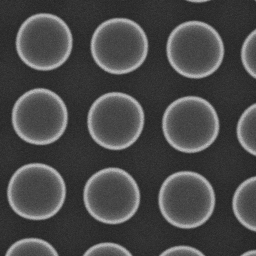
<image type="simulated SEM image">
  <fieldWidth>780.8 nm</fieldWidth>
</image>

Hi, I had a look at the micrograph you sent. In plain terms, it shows an array of small figures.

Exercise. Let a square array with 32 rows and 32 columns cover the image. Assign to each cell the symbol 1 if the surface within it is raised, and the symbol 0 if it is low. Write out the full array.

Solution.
00000000000000000000000000000000
00000000000000000000000000000000
00011111000001110000000000000000
00011111100011111100001111100000
00111111100011111100011111100001
00111111100111111100011111110011
00111111100111111100011111110011
00011111000011111100011111110011
00001110000001111000001111100001
00000000000000000000000111000001
00000000000000000000000000000000
00011110000000000000000000000000
00111111000011111000001111000000
00111111000111111100011111100001
00111111000111111100111111100011
00111111000111111100111111100011
00111111000111111100111111100011
00011110000011111000011111100011
00000000000001110000001111000011
00000000000000000000000000000000
00001000000000000000000000000000
00111110000011110000001100000000
01111111000111111000011111000001
01111111000111111000111111100011
01111111001111111000111111100111
01111111000111111000111111100111
00111110000111111000111111100111
00000000000011110000011111000011
00000000000000000000001100000001
00000000000000000000000000000000
00111100000011000000000000000000
01111110000111110000111110000001